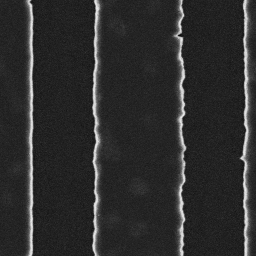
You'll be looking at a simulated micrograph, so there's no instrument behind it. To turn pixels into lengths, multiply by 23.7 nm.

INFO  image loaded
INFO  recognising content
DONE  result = one or a few lines or trenches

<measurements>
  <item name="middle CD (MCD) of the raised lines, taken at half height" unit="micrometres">2.05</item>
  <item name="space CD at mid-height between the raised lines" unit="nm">1500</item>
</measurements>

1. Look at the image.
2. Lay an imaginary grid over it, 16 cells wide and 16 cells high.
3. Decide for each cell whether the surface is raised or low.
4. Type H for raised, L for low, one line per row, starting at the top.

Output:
HHLLLLHHHHHLLLLH
HHLLLLHHHHHLLLLH
HHLLLLHHHHHLLLLH
HHLLLLHHHHHLLLLH
HHLLLLHHHHHLLLLH
HHLLLLHHHHHLLLLH
HHLLLLHHHHHLLLLH
HHLLLLHHHHHLLLLH
HHLLLLHHHHHLLLLH
HHLLLLHHHHHHLLLH
HHLLLLHHHHHHLLLH
HHLLLLHHHHHLLLLH
HHLLLLHHHHHLLLLH
HHLLLLHHHHHLLLLH
HHLLLLHHHHHLLLLH
HHLLLLHHHHHLLLLH